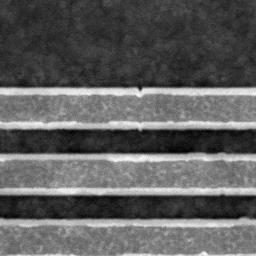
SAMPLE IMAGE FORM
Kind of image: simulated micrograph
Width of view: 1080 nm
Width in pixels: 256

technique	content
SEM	one or a few lines or trenches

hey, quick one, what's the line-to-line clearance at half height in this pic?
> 0.128 micrometres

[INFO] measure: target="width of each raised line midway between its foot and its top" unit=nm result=150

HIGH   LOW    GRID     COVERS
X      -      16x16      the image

----------------
----------------
----------------
----------------
----------------
----------------
XXXXXXXXXXXXXXXX
XXXXXXXXXXXXXXXX
----------------
----------------
XXXXXXXXXXXXXXXX
XXXXXXXXXXXXXXXX
----------------
----------------
XXXXXXXXXXXXXXXX
XXXXXXXXXXXXXXXX